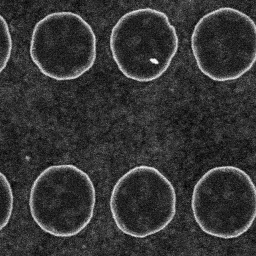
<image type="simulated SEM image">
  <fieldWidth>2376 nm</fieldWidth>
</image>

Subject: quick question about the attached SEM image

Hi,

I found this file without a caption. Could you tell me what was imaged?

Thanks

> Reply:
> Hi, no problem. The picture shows raised bodies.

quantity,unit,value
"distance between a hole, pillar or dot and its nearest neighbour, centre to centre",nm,744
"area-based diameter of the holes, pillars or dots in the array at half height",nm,625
